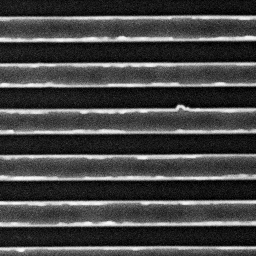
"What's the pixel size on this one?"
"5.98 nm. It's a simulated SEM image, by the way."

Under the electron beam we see parallel lines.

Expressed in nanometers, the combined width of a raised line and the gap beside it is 276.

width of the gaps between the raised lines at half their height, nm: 132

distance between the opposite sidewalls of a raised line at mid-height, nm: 142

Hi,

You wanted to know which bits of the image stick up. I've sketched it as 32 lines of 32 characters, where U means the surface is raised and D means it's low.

DDDDDDDDDDDDDDDDDDDDDDDDDDDDDDDD
DDDDDDDDDDDDDDDDDDDDDDDDDDDDDDDD
UUUUUUUUUUUUUUUUUUUUUUUUUUUUUUUU
UUUUUUUUUUUUUUUUUUUUUUUUUUUUUUUU
UUUUUUUUUUUUUUUUUUUUUUUUUUUUUUUU
DDDDDDDDDDDDDDDDDDDDDDDDDDDDDDDD
DDDDDDDDDDDDDDDDDDDDDDDDDDDDDDDD
DDDDDDDDDDDDDDDDDDDDDDDDDDDDDDDD
UUUUUUUUUUUUUUUUUUUUUUUUUUUUUUUU
UUUUUUUUUUUUUUUUUUUUUUUUUUUUUUUU
UUUUUUUUUUUUUUUUUUUUUUUUUUUUUUUU
DDDDDDDDDDDDDDDDDDDDDDDDDDDDDDDD
DDDDDDDDDDDDDDDDDDDDDDDDDDDDDDDD
DDDDDDDDDDDDDDDDDDDDDDUDDDDDDDDD
UUUUUUUUUUUUUUUUUUUUUUUUUUUUUUUU
UUUUUUUUUUUUUUUUUUUUUUUUUUUUUUUU
UUUUUUUUUUUUUUUUDDDDDUUUUUUUDDDD
DDDDDDDDDDDDDDDDDDDDDDDDDDDDDDDD
DDDDDDDDDDDDDDDDDDDDDDDDDDDDDDDD
DDDDDDDDDDDUUUUUUUUUUUUUUUUUUUUU
UUUUUUUUUUUUUUUUUUUUUUUUUUUUUUUU
UUUUUUUUUUUUUUUUUUUUUUUUUUUUUUUU
DDDDDDDDDDDDDDDDDDDDDDDDDDDDDDDD
DDDDDDDDDDDDDDDDDDDDDDDDDDDDDDDD
DDDDDDDDDDDDDDDDDDDDDDDDDDDDDDDD
UUUUUUUUUUUUUUUUUUUUUUUUUUUUUUUU
UUUUUUUUUUUUUUUUUUUUUUUUUUUUUUUU
UUUUUUUUUUUUUUUUUUUUUUUUUUUUUUUU
DDDDDDDDDDDDDDDDDDDDDDDDDDDDDDDD
DDDDDDDDDDDDDDDDDDDDDDDDDDDDDDDD
DDDDDDDDDDDDDDDDDDDDDDDDDDDDDDDD
UUUUUUUUUUUUUUUUUUUUUUUUUUUUUUUU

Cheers